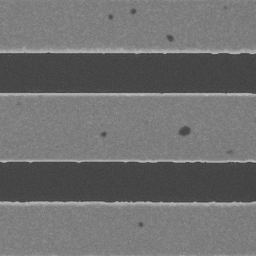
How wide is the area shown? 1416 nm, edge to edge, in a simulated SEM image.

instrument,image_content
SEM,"lines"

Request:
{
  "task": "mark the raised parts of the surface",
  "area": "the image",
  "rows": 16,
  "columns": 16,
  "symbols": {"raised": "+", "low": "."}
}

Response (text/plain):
++++++++++++++++
++++++++++++++++
++++++++++++++++
................
................
................
++++++++++++++++
++++++++++++++++
++++++++++++++++
++++++++++++++++
................
................
................
++++++++++++++++
++++++++++++++++
++++++++++++++++